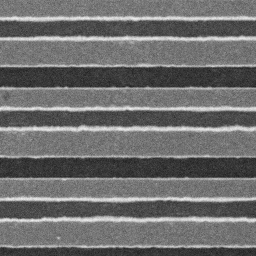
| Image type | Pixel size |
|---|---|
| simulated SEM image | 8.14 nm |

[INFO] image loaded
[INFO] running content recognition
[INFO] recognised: lines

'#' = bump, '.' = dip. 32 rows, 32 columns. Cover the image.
################################
################################
................................
................................
................................
################################
################################
################################
................................
................................
................................
################################
################################
################################
................................
................................
################################
################################
################################
################################
................................
................................
################################
################################
################################
................................
................................
################################
################################
################################
################################
................................